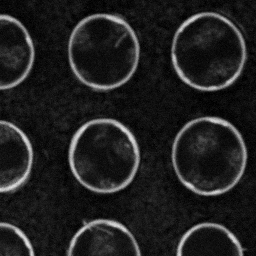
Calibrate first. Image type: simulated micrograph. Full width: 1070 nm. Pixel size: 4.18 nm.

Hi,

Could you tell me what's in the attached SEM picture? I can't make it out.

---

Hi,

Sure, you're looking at raised bodies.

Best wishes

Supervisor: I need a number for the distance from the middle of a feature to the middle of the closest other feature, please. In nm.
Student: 436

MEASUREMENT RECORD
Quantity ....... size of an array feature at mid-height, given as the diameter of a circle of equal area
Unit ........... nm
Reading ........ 303